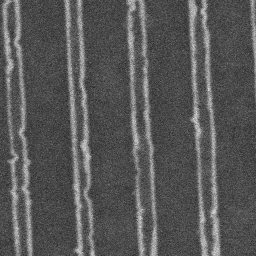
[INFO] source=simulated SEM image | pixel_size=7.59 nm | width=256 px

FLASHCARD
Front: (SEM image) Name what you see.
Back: one or a few lines or trenches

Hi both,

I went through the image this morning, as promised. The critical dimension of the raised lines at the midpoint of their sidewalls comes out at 112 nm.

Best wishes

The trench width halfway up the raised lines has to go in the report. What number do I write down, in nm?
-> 360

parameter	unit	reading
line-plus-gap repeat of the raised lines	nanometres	472